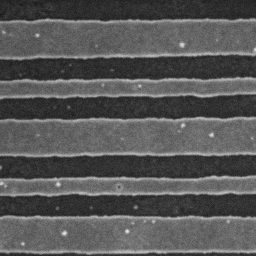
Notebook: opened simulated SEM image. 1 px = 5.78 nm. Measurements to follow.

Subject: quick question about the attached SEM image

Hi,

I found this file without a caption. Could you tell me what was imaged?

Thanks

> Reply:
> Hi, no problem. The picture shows lines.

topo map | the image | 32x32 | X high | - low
--------------------------------
--------------------------------
-----XXX--------XX--XXXXXXXXXXXX
XXXXXXXXXXXXXXXXXXXXXXXXXXXXXXXX
XXXXXXXXXXXXXXXXXXXXXXXXXXXXXXXX
XXXXXXXXXXXXXXXXXXXXXXXXXXXXXXXX
XXXXXXXXXXXXXXXXXXXXXXXXXXXXXXXX
--------------------------------
--------------------------------
--------------------------------
XXXXXXXXXXXXXXXXXXXXXXXXXXXXXXXX
XXXXXXXXXXXXXXXXXXXXXXXXXXXXXXXX
--------------------------------
--------------------------------
--------------------------------
XXXXXXXXXXXXXXXXXXXXXXXXXXXXXXXX
XXXXXXXXXXXXXXXXXXXXXXXXXXXXXXXX
XXXXXXXXXXXXXXXXXXXXXXXXXXXXXXXX
XXXXXXXXXXXXXXXXXXXXXXXXXXXXXXXX
---XXXXXX-----------------------
--------------------------------
--------------------------------
XXXXXXXXXXXXXXXXXXXXXXXXXXXXXXXX
XXXXXXXXXXXXXXXXXXXXXXXXXXXXXXXX
-X----X-------------------------
--------------------------------
--------------------------------
XXXXXXXXXXXXXXXXXXXXXXXXXXXXXXXX
XXXXXXXXXXXXXXXXXXXXXXXXXXXXXXXX
XXXXXXXXXXXXXXXXXXXXXXXXXXXXXXXX
XXXXXXXXXXXXXXXXXXXXXXXXXXXXXXXX
XXXXXXXXXXXXXXXXXXXXXXXXXXXXXXXX